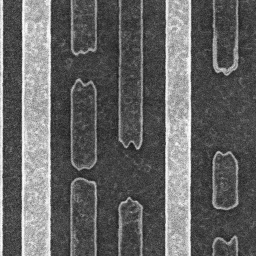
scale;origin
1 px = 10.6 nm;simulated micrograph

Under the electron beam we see parallel lines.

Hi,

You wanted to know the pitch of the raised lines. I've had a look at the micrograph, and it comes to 500 nm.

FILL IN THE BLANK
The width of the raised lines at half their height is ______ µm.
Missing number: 0.247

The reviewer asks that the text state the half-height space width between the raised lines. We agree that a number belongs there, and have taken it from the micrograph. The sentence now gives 247 nm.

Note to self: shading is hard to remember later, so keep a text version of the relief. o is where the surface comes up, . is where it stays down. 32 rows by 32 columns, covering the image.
...ooo...ooo...ooo...ooo...ooo..
...ooo...ooo...ooo...ooo...ooo..
...ooo...ooo...ooo...ooo...ooo..
...ooo...ooo...ooo...ooo...ooo..
...ooo...ooo...ooo...ooo...ooo..
...ooo...ooo...ooo...ooo...ooo..
...ooo...oo....ooo...ooo.....o..
...ooo.........ooo...ooo........
...ooo.........ooo...ooo...oo...
...ooo.........ooo...ooo........
...ooo...ooo...ooo...ooo........
...ooo...ooo...ooo...ooo........
...ooo...ooo...ooo...ooo........
...ooo...ooo...ooo...ooo........
...ooo...ooo...ooo...ooo........
...ooo...ooo...ooo...ooo........
...ooo...ooo...ooo...ooo........
...ooo...ooo...ooo...ooo........
...ooo...ooo.........ooo........
...ooo...ooo.........ooo...oo...
...ooo...ooo.........ooo...ooo..
...ooo...............ooo...ooo..
...ooo...oo..........ooo...ooo..
...ooo...ooo.........ooo...ooo..
...ooo...ooo.........ooo...ooo..
...ooo...ooo...oo....ooo...oo...
...ooo...ooo...ooo...ooo........
...ooo...ooo...ooo...ooo........
...ooo...ooo...ooo...ooo........
...ooo...ooo...ooo...ooo........
...ooo...ooo...ooo...ooo...ooo..
...ooo...ooo...ooo...ooo...ooo..